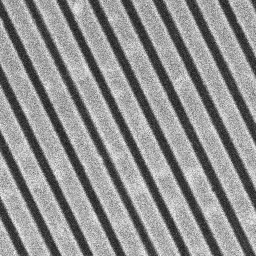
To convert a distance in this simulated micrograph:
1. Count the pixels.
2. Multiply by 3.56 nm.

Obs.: parallel lines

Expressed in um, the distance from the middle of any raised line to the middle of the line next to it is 0.104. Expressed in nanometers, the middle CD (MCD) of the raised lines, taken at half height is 69.3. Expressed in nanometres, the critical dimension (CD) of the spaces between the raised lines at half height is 34.4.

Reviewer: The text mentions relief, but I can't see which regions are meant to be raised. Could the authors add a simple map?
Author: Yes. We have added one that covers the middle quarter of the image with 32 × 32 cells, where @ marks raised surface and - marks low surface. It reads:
-@@@@@---@@@@@---@@@@@---@@@@@--
-@@@@@---@@@@@---@@@@@@--@@@@@@-
--@@@@@---@@@@@---@@@@@---@@@@@-
--@@@@@---@@@@@---@@@@@---@@@@@@
---@@@@@---@@@@@---@@@@@---@@@@@
---@@@@@---@@@@@---@@@@@---@@@@@
@--@@@@@@---@@@@@---@@@@@---@@@@
@---@@@@@---@@@@@---@@@@@---@@@@
@@--@@@@@@---@@@@@---@@@@@---@@@
@@---@@@@@---@@@@@---@@@@@---@@@
@@@--@@@@@@---@@@@@---@@@@@---@@
@@@---@@@@@---@@@@@---@@@@@---@@
@@@@--@@@@@@---@@@@@---@@@@@---@
@@@@---@@@@@---@@@@@---@@@@@---@
@@@@@--@@@@@@--@@@@@@---@@@@@---
@@@@@---@@@@@---@@@@@---@@@@@---
@@@@@@--@@@@@@--@@@@@@---@@@@@--
-@@@@@---@@@@@---@@@@@---@@@@@--
-@@@@@@--@@@@@@--@@@@@@---@@@@@-
--@@@@@---@@@@@---@@@@@---@@@@@-
--@@@@@@--@@@@@@--@@@@@@---@@@@@
---@@@@@---@@@@@---@@@@@---@@@@@
@--@@@@@@--@@@@@@--@@@@@@--@@@@@
@---@@@@@@--@@@@@---@@@@@---@@@@
@---@@@@@@--@@@@@@--@@@@@@--@@@@
@@---@@@@@---@@@@@---@@@@@---@@@
@@---@@@@@@--@@@@@@--@@@@@@--@@@
@@@---@@@@@---@@@@@---@@@@@---@@
@@@@--@@@@@@--@@@@@@--@@@@@@--@@
@@@@---@@@@@---@@@@@---@@@@@---@
@@@@---@@@@@@--@@@@@@--@@@@@@--@
@@@@@---@@@@@---@@@@@---@@@@@---